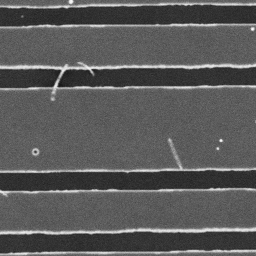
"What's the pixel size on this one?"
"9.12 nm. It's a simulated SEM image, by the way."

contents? lines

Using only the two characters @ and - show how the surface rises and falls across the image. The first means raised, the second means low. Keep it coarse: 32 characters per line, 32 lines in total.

@@@@@@@@@@@@@@@@@@@@@@@@---@@@@@
--------------------------------
--------------------------------
@@@@@@@@@@@@@@@@@@@@@@@@@@@@@@@@
@@@@@@@@@@@@@@@@@@@@@@@@@@@@@@@@
@@@@@@@@@@@@@@@@@@@@@@@@@@@@@@@@
@@@@@@@@@@@@@@@@@@@@@@@@@@@@@@@@
@@@@@@@@@@@@@@@@@@@@@@@@@@@@@@@@
@@@--@@@@@@@@@@-----------------
--------------------------------
--------------------------------
@@@@@@@@@@@@@@@@@@@@@@@@@@@@@@@@
@@@@@@@@@@@@@@@@@@@@@@@@@@@@@@@@
@@@@@@@@@@@@@@@@@@@@@@@@@@@@@@@@
@@@@@@@@@@@@@@@@@@@@@@@@@@@@@@@@
@@@@@@@@@@@@@@@@@@@@@@@@@@@@@@@@
@@@@@@@@@@@@@@@@@@@@@@@@@@@@@@@@
@@@@@@@@@@@@@@@@@@@@@@@@@@@@@@@@
@@@@@@@@@@@@@@@@@@@@@@@@@@@@@@@@
@@@@@@@@@@@@@@@@@@@@@@@@@@@@@@@@
@@@@@@@@@@@@@@@@@@@@@@@@@@@@@@@@
@@@@@@@--------@----------------
--------------------------------
--------------------------------
@@@@@@@@@@@@@@@@@@@@@@@@@@@@@@@@
@@@@@@@@@@@@@@@@@@@@@@@@@@@@@@@@
@@@@@@@@@@@@@@@@@@@@@@@@@@@@@@@@
@@@@@@@@@@@@@@@@@@@@@@@@@@@@@@@@
@@@@@@@@@@@@@@@@@@@@@@@@@@@@@@@@
--------------------------------
--------------------------------
---------------------@@@@@@@@@@@